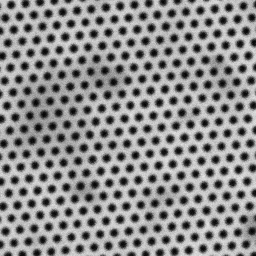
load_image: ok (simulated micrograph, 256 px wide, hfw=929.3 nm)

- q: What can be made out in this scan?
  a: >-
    a regular array of holes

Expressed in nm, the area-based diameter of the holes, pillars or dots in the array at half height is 30.7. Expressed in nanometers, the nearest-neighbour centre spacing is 51.3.